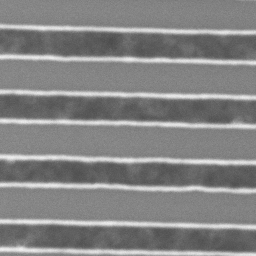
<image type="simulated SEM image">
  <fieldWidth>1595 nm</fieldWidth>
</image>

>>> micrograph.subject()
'one or a few lines or trenches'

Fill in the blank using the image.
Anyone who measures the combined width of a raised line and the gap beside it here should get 0.401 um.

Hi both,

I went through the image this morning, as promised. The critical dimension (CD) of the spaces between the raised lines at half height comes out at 223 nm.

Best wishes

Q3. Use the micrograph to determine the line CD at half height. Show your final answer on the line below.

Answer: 180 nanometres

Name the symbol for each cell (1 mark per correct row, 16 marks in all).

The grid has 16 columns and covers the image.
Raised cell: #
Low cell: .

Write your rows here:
................
................
################
################
................
................
################
################
................
................
################
################
................
................
################
################